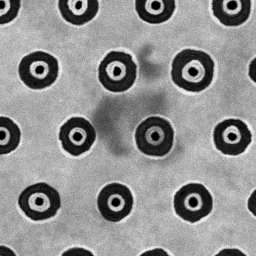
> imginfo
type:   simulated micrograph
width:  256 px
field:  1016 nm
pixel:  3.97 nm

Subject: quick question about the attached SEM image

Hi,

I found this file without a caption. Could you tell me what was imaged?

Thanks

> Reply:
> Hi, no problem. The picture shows a regular array of ring-shaped grooves with a dot in the middle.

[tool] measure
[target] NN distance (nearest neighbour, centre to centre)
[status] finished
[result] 0.297 µm